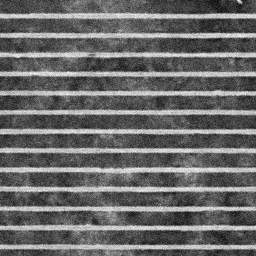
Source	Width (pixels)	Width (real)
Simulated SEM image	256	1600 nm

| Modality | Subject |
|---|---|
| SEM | parallel lines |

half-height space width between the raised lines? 95.4 nm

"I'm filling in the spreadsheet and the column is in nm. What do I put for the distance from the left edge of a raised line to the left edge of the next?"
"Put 120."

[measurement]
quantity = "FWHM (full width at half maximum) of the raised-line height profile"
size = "0.0242 um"